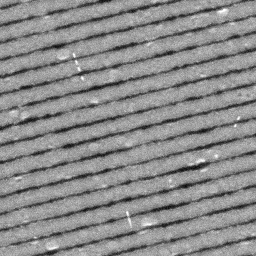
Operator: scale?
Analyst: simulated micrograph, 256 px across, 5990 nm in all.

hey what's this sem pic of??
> parallel lines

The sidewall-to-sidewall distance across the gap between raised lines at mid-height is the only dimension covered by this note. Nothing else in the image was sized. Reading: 0.293 um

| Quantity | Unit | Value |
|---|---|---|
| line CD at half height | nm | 91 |